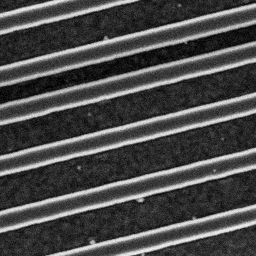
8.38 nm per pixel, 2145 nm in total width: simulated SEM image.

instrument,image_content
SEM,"lines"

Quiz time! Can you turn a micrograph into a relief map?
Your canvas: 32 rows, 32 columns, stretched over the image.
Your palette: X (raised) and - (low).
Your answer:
-----XXXXXXXXXX-----------------
-XXXXXXXXXX-----------------XXXX
XXXXXXX-----------------XXXXXXXX
XXX-----------------XXXXXXXXX---
----------------XXXXXXXXX-------
------------XXXXXXXXX----------X
--------XXXXXXXXX----------XXXXX
----XXXXXXXXX----------XXXXXXXXX
XXXXXXXXX----------XXXXXXXXX----
XXXXX----------XXXXXXXXX--------
X----------XXXXXXXXX------------
-------XXXXXXXXX----------------
---XXXXXXXXX-----------------XXX
XXXXXXXX----------------XXXXXXXX
XXXX----------------XXXXXXXXXX--
-----------------XXXXXXXXX------
------------XXXXXXXXXX----------
--------XXXXXXXXXX--------------
----XXXXXXXXXX------------------
XXXXXXXXX-------------------XXXX
XXXXXX------------------XXXXXXXX
X-------------------XXXXXXXXX---
----------------XXXXXXXXXX------
------------XXXXXXXXXX----------
--------XXXXXXXXXX--------------
----XXXXXXXXXX------------------
XXXXXXXXX-------------------XXXX
XXXXXX------------------XXXXXXXX
XX------------------XXXXXXXXXX--
----------------XXXXXXXXXX------
------------XXXXXXXXX-----------
--------XXXXXXXXXX--------------